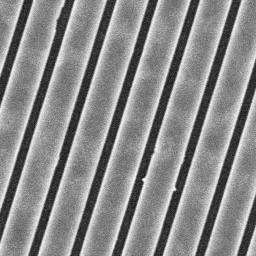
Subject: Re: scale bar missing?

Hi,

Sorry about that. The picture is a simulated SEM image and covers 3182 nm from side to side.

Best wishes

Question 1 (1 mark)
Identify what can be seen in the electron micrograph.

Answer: parallel lines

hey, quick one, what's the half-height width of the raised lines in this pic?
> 365 nanometers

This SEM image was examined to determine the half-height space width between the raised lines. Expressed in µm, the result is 0.129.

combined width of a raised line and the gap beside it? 495 nanometres